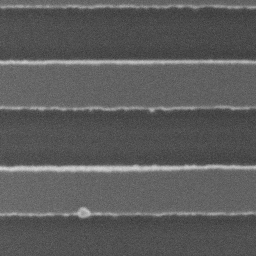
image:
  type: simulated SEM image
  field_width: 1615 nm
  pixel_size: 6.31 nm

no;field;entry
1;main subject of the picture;lines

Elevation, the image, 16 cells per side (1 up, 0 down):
0000000000000000
0000000000000000
0000000000000000
0000000000000000
1111111111111111
1111111111111111
1111111111111111
0000000000000000
0000000000000000
0000000000000000
1111111111111111
1111111111111111
1111111111111111
0000010000000000
0000000000000000
0000000000000000